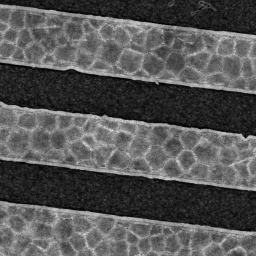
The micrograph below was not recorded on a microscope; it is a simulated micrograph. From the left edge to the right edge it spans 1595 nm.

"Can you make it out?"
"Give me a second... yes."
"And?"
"one or a few lines or trenches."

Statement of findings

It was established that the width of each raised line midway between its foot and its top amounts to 329 nanometers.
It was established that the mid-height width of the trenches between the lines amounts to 274 nanometers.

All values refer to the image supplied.